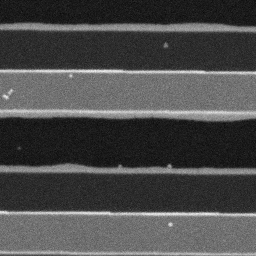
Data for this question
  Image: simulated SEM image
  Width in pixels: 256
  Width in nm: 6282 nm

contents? lines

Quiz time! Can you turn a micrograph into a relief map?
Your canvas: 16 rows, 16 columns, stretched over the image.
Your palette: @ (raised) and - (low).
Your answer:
----------------
----------------
@@@@@@@@@@@@@@@@
@@@@@@@@@@@@@@@@
@@@@@@@@@@@@@@@@
@@@@@@@@@@@@@@@@
@@@@@@@@@@@@@@@@
----------------
----------------
----------------
----------------
@@@@@@@@@@@@@@@@
@@@@@@@@@@@@@@@@
@@@@@@@@@@@@@@@@
@@@@@@@@@@@@@@@@
@@@@@@@@@@@@@@@@